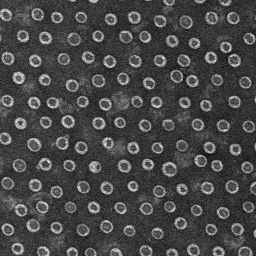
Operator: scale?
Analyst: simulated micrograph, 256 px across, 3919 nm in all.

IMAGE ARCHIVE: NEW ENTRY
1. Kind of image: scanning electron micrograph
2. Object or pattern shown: a regular array of raised bodies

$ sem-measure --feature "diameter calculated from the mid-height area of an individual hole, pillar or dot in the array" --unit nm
176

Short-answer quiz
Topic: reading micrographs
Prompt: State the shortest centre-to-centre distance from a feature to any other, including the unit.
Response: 328 nm